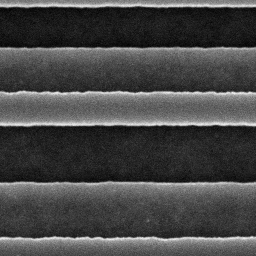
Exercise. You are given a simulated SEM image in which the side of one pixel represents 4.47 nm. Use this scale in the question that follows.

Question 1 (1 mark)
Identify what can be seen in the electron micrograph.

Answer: lines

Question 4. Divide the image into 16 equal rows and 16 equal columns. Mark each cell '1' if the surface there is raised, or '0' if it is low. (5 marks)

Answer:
0000000000000000
0000000000000000
0000000000000000
1111111111111111
1111111111111111
1111111111111111
1111111111111111
1111111111111111
0000000000000000
0000000000000000
0000000000000000
1111111111111111
1111111111111111
1111111111111111
1111111111111111
1111111111111111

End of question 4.